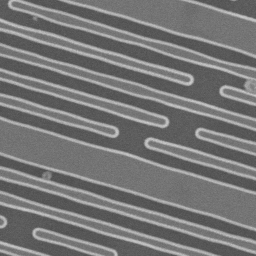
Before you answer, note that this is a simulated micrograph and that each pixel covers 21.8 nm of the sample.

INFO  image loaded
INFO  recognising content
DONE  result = groups of lines, slits or small figures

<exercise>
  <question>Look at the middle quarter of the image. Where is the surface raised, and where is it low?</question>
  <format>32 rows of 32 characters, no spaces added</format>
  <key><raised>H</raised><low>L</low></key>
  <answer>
HHHLLLLLLLLLLLLHHHHHHHHLLLLLLLLL
HHHHHHLLLLLLLLLLLLLHHHHHHHHLLLLL
LHHHHHHHHLLLLLLLLLLLLLHHHHHHHHLL
LLLLHHHHHHHHHLLLLLLLLLLLLLHHHHHH
LLLLLLLLHHHHHHHHHLLLLLLLLLLLLHHH
LLLLLLLLLLLHHHHHHHHHLLLLLLLLLLLL
HHLLLLLLLLLLLLHHHHHHHHHLLLLLLLLL
HHHHHLLLLLLLLLLLLHHHHHHHHHLLLLLL
HHHHHHHHHLLLLLLLLLLLLLHHHHHHHHLL
LLLLHHHHHHHHHLLLLLLLLLLLLHHHHHHH
LLLLLLLHHHHHHHHHLLLLLLLLLLLLHHHH
LLLLLLLLLLHHHHHHHHHLLLLLLLLLLLLH
HLLLLLLLLLLLLHHHHHHHHHLLLLLLLLLL
HHHHLLLLLLLLLLLLLHHHHHHHHLLLLLLL
HHHHHHHLLLLLLLLLLLLLHHHHHHLLLLLL
LLLHHHHHHHHLLLLLLLLLLLLLLLLLLLLL
LLLLLLLHHHHHHLLLLLLLLLLLLLLLLLLL
LLLLLLLLLLHHHLLLLLLLLLLLLLLLLLLL
HLLLLLLLLLLLLLLLLLLLLLLLLLLLLLLL
HHHHLLLLLLLLLLLLLLLLLHHHHLLLLLLL
HHHHHHHHLLLLLLLLLLLLLHHHHHHHHLLL
HHHHHHHHHHHHLLLLLLLLLLLLHHHHHHHH
HHHHHHHHHHHHHHHHLLLLLLLLLLLHHHHH
HHHHHHHHHHHHHHHHHHHLLLLLLLLLLLHH
HHHHHHHHHHHHHHHHHHHHHHLLLLLLLLLL
HHHHHHHHHHHHHHHHHHHHHHHHHLLLLLLL
HHHHHHHHHHHHHHHHHHHHHHHHHHHHLLLL
LHHHHHHHHHHHHHHHHHHHHHHHHHHHHHHH
LLLLLHHHHHHHHHHHHHHHHHHHHHHHHHHH
LLLLLLLLHHHHHHHHHHHHHHHHHHHHHHHH
LLLLLLLLLLLLHHHHHHHHHHHHHHHHHHHH
HHHHLLLLLLLLLLLHHHHHHHHHHHHHHHHH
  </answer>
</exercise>